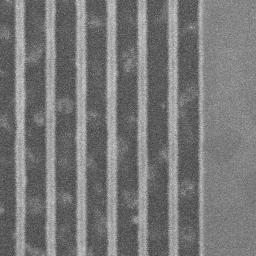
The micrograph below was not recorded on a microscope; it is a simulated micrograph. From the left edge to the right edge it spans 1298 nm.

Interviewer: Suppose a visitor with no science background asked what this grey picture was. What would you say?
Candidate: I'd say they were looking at parallel lines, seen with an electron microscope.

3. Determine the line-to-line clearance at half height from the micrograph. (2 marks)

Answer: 122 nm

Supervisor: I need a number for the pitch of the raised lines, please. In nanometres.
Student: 155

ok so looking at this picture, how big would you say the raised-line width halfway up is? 31.7 nanometers